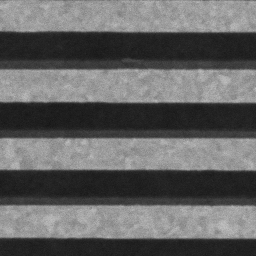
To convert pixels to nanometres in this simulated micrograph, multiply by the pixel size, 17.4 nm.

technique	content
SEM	lines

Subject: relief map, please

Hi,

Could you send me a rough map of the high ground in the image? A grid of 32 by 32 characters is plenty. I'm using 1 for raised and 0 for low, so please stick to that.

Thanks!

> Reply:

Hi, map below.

11111111111111111111111111111111
11111111111111111111111111111111
11111111111111111111111111111111
11111111111111111111111111111111
00000000000000000000000000000000
00000000000000000000000000000000
00000000000000000000000000000000
00000000000000011000000000000000
11111111111111111111111111111111
11111111111111111111111111111111
11111111111111111111111111111111
11111111111111111111111111111111
11111111111111111111111111111111
00000000000000000000000000000000
00000000000000000000000000000000
00000000000000000000000000000000
11111111111111111111111111100000
11111111111111111111111111111111
11111111111111111111111111111111
11111111111111111111111111111111
11111111111111111111111111111111
00000000000000000000000000000000
00000000000000000000000000000000
00000000000000000000000000000000
00000000000000000000000000000000
11111111111111111111111111111111
11111111111111111111111111111111
11111111111111111111111111111111
11111111111111111111111111111111
11111111111111111111111111111111
00000000000000000000000000000000
00000000000000000000000000000000